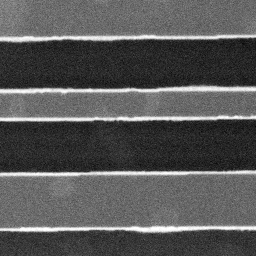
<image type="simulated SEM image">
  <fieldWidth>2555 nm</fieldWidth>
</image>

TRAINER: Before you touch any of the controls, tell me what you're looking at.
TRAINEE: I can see lines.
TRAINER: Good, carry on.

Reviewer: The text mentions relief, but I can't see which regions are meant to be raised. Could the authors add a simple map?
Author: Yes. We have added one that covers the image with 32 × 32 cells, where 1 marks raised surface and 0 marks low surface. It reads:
11111111111111111111111111111111
11111111111111111111111111111111
11111111111111111111111111111111
11111111111111111111111111111111
11111111111111111111111111110000
00000000000000000000000000000000
00000000000000000000000000000000
00000000000000000000000000000000
00000000000000000000000000000000
00000000000000000000000000000000
00000000000000000000000000000000
11111111111111111111111111111111
11111111111111111111111111111111
11111111111111111111111111111111
11111111111111111111111111111111
00000000000000000000000000000000
00000000000000000000000000000000
00000000000000000000000000000000
00000000000000000000000000000000
00000000000000000000000000000000
00000000000000000000000000000000
00000000000000000000000000000000
11111111111111111111111111111111
11111111111111111111111111111111
11111111111111111111111111111111
11111111111111111111111111111111
11111111111111111111111111111111
11111111111111111111111111111111
11111111111111111111111000001000
00000000000000000000000000000000
00000000000000000000000000000000
00000000000000000000000000000000